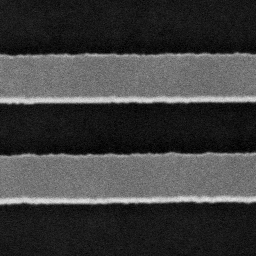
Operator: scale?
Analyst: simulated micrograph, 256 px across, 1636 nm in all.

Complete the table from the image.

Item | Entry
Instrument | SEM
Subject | lines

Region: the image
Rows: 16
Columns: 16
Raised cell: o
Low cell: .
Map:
................
................
................
oooooooooooooooo
oooooooooooooooo
oooooooooooooooo
................
................
................
................
oooooooooooooooo
oooooooooooooooo
ooooooooooo.oo.o
................
................
................